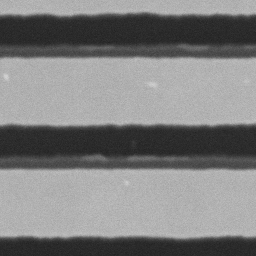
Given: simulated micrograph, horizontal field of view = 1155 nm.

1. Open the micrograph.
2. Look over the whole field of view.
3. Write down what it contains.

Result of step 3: lines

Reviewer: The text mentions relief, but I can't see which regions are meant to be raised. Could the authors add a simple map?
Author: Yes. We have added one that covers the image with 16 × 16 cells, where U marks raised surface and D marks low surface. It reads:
UUUUUUUUUUUUUUUU
DDDDDDDDDDDDDDDD
DDDDDDDDDDDDDDDD
DDDDDDDDDDDDDDDD
UUUUUUUUUUUUUUUU
UUUUUUUUUUUUUUUU
UUUUUUUUUUUUUUUU
UUUUUUUUUUUUUUUU
DDDDDDDDDDDDDDDD
DDDDDDDDDDDDDDDD
DDDDDDDDDDDDDDDD
UUUUUUUUUUUUUUUU
UUUUUUUUUUUUUUUU
UUUUUUUUUUUUUUUU
UUUUUUUUUUUUUUUU
DDDDDDDDDDDDDDDD